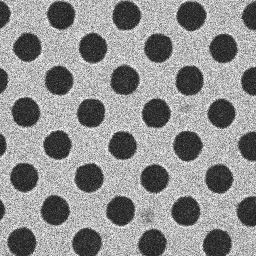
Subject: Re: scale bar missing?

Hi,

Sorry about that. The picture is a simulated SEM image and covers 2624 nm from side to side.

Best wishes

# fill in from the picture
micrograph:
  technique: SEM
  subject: a regular array of holes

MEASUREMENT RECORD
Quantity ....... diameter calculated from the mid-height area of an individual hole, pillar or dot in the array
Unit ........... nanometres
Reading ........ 305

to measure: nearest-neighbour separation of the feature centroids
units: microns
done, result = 0.466